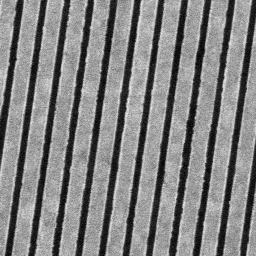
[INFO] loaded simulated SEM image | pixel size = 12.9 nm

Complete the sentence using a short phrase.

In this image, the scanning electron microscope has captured parallel lines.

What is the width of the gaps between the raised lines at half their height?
110 nm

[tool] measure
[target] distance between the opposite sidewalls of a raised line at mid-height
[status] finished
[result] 185 nm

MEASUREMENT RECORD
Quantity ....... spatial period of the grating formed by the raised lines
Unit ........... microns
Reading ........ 0.299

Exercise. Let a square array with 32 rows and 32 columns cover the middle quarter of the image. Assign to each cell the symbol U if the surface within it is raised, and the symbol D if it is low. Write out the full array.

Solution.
UUUDDDUUUDDUUUUDDUUUUDDUUUUDDUUU
UUUDDDUUUDDUUUUDDUUUUDDUUUUDDUUU
UUUDDUUUUDDUUUUDDUUUUDDUUUDDDUUU
UUUDDUUUUDDUUUDDDUUUUDDUUUDDDUUU
UUUDDUUUUDDUUUDDDUUUDDDUUUDDUUUU
UUUDDUUUDDDUUUDDDUUUDDDUUUDDUUUU
UUDDDUUUDDDUUUDDDUUUDDUUUUDDUUUU
UUDDDUUUDDUUUUDDUUUUDDUUUUDDUUUU
UUDDUUUUDDUUUUDDUUUUDDUUUUDDUUUD
UUDDUUUUDDUUUUDDUUUUDDUUUDDDUUUD
UUDDUUUUDDUUUUDDUUUUDDUUUDDDUUUD
UUDDUUUUDDUUUDDDUUUUDDUUUDDDUUUD
UDDDUUUUDDUUUDDDUUUDDDUUUDDUUUUD
UDDDUUUUDDUUUDDDUUUDDUUUUDDUUUUD
UDDDUUUDDUUUUDDDUUUDDUUUUDDUUUUD
UDDDUUUDDUUUUDDUUUUDDUUUUDDUUUDD
UDDUUUUDDUUUUDDUUUUDDUUUDDDUUUDD
UDDUUUUDDUUUUDDUUUUDDUUUDDDUUUDD
UDDUUUUDDUUUDDDUUUDDDUUUDDDUUUDD
UDDUUUDDDUUUDDDUUUDDDUUUDDUUUUDD
UDDUUUDDDUUUDDUUUUDDUUUUDDUUUUDD
DDDUUUDDUUUUDDUUUUDDUUUUDDUUUUDD
DDUUUUDDUUUUDDUUUUDDUUUUDDUUUDDD
DDUUUUDDUUUUDDUUUUDDUUUUDDUUUDDD
DDUUUUDDUUUUDDUUUUDDUUUDDDUUUDDU
DDUUUUDDUUUDDDUUUDDDUUUDDDUUUDDU
DDUUUDDDUUUDDDUUUDDDUUUDDUUUUDDU
DDUUUDDUUUUDDDUUUDDUUUUDDUUUUDDU
DDUUUDDUUUUDDDUUUDDUUUUDDUUUUDDU
DDUUUDDUUUUDDUUUUDDUUUUDDUUUDDDU
DUUUUDDUUUUDDUUUUDDUUUUDDUUUDDDU
DUUUUDDUUUUDDUUUUDDUUUUDDUUUDDUU